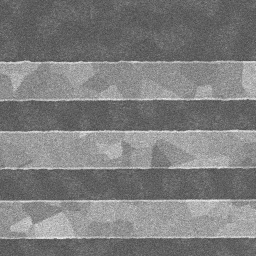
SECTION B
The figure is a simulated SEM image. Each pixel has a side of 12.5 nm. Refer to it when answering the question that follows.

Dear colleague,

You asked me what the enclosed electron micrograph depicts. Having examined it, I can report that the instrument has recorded one or a few lines or trenches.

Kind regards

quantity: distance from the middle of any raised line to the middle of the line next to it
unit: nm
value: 866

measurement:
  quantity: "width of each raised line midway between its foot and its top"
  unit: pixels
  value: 37.1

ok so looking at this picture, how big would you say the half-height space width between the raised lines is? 411 nm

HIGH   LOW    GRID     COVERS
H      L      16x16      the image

LLLLLLLLLLLLLLLL
LLLLLLLLLLLLLLLL
LLLLLLLLLLLLLLLL
LLLLLLLLLLLLLLLL
HHHHHHHHHHHHHHHH
HHHHHHHHHHHHHHHH
LLLLLLLLLLLLLLLL
LLLLLLLLLLLLLLLL
HHHHHHHHHHHHHHHH
HHHHHHHHHHHHHHHH
HHHHHHHHLHHHLLLL
LLLLLLLLLLLLLLLL
LLLLLLLLLLLLLLLL
HHHHHHHHHHHHHHHH
HHHHHHHHHHHHHHHH
LLLLLLLLLLLLLLLL